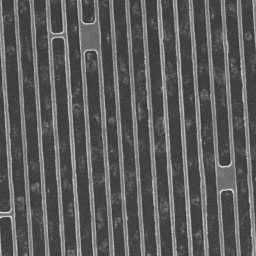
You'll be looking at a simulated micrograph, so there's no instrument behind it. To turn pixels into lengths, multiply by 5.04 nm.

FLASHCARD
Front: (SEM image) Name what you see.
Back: parallel lines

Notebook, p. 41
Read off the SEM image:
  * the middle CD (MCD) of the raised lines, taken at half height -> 18.2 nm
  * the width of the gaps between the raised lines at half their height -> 0.0628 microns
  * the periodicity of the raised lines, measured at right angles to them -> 80.3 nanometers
